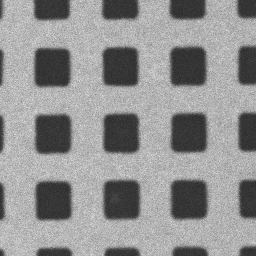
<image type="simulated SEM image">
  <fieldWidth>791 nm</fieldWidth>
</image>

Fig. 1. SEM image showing a regular array of holes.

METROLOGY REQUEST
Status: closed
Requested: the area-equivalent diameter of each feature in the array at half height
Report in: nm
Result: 125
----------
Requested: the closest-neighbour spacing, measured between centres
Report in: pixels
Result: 66.6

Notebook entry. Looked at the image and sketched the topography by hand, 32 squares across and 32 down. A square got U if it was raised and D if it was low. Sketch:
UUUUDDDDDUUUUDDDDUUUUDDDDDUUUUDD
UUUUDDDDDUUUUDDDDUUUUDDDDDUUUUDD
UUUUUDUUUUUUUUDUUUUUUUUUUUUUUUUU
UUUUUUUUUUUUUUUUUUUUUUUUUUUUUUUU
UUUUUUUUUUUUUUUUUUUUUUUUUUUUUUUU
UUUUUUUUUUUUUUUUUUUUUUUUUUUUUUUU
UUUUUDDDDUUUUDDDDUUUUDDDDDUUUUDD
UUUUDDDDDUUUUDDDDUUUUDDDDDUUUUDD
UUUUDDDDDUUUUDDDDUUUUDDDDDUUUUDD
UUUUDDDDDUUUUDDDDUUUUDDDDDUUUUDD
UUUUUDDDDUUUUDDDDUUUUUDDDUUUUUDD
UUUUUUUUUUUUUUUUUUUUUUUUUUUUUUUU
UUUUUUUUUUUUUUUUUUUUUUUUUUUUUUUU
UUUUUUUUUUUUUUUUUUUUUUUUUUUUUUUU
UUUUUDDDUUUUUDDDDUUUUUDDDUUUUUDD
UUUUDDDDDUUUUDDDDUUUUDDDDDUUUUDD
UUUUDDDDDUUUUDDDDUUUUDDDDDUUUUDD
UUUUDDDDDUUUUDDDDUUUUDDDDDUUUUDD
UUUUUDDDDUUUUDDDDUUUUUDDDDUUUUDD
UUUUUUUUUUUUUUUUUUUUUUUUUUUUUUUU
UUUUUUUUUUUUUUUUUUUUUUUUUUUUUUUU
UUUUUUUUUUUUUUUUUUUUUUUUUUUUUUUU
UUUUUUUUUUUUUUUUUUUUUUUUUUUUUUUD
UUUUUDDDDUUUUDDDDUUUUDDDDDUUUUDD
DUUUDDDDDUUUUDDDDUUUUDDDDDUUUUDD
UUUUDDDDDUUUUDDDDUUUUDDDDDUUUUDD
DUUUDDDDDUUUUDDDDUUUUDDDDDUUUUDD
UUUUUUDDUUUUUUUUUUUUUUUUUUUUUUUU
UUUUUUUUUUUUUUUUUUUUUUUUUUUUUUUU
UUUUUUUUUUUUUUUUUUUUUUUUUUUUUUUU
UUUUUUUUUUUUUUUUUUUUUUUUUUUUUUUU
UUUUUDDDDUUUUDDDDUUUUUDDDDUUUUDD